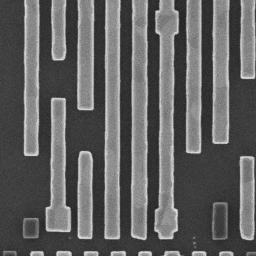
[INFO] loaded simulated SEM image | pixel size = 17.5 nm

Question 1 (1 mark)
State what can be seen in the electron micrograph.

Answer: wiring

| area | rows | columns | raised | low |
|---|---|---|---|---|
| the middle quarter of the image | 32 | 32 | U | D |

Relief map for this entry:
DDDDUUUDDDUUUUDDDUUUUDDDUUUDDDDU
DDDDUUUDDDUUUUDDDUUUUDDDUUUDDDDU
DDDDUUUDDDDUUUDDDUUUUDDDUUUDDDDU
DDDDUUUDDDDUUUDDDUUUUDDDUUUDDDDU
DDDDUUUDDDDUUUDDDUUUUDDDUUUDDDDU
DDDDUUUDDDDUUUDDDUUUUDDDUUUDDDDU
DDDDUUUDDDDUUUDDDUUUUDDDUUUDDDDU
DDDDUUUDDDDUUUDDDUUUUDDDUUUDDDDU
DDDDUUUDDDDUUUDDDUUUUDDDUUUDDDDU
DDDDUUUDDDDUUUDDDUUUUDDDUUUDDDDU
DDDDUUUDDDDUUUDDDUUUUDDDUUUDDDDU
DDDDDDDDDDDUUUDDDUUUUDDDUUUDDDDU
DDDDDDDDDDDUUUDDDUUUUDDDUUUDDDDU
DDDDDDDDDDDUUUDDDUUUUDDDUUUDDDDU
DDDDDDDDDDDUUUDDDUUUUDDDUUUDDDDU
DDDDDDDDDDDUUUDDDUUUUDDDUUUDDDDU
DDDDDDDDDDDUUUDDDUUUUDDDUUUDDDDU
DDDDDDDDDDUUUUDDDUUUUDDDUUUDDDDU
DDDDDDDDDDUUUUDDDUUUUDDDUUUDDDDU
DDDDDDDDDDUUUUDDDUUUUDDDUUUDDDDU
DDDDDDDDDDUUUUDDDUUUUDDDUUUDDDDU
DDDDDDDDDDUUUUDDDUUUUDDDUUUDDDDU
DDDDUUUDDDUUUUDDDUUUUDDDUUUDDDDD
DDDDUUUDDDUUUUDDDUUUUDDDUUUDDDDD
DDDDUUUDDDUUUUDDDUUUUDDDUUUDDDDD
DDDDUUUDDDUUUUDDDUUUUDDDUUUDDDDD
DDDDUUUDDDUUUUDDDUUUUDDDUUUDDDDD
DDDDUUUDDDUUUUDDDUUUUDDDUUUDDDDD
DDDDUUUDDDUUUUDDDUUUUDDDUUUDDDDD
DDDDUUUDDDUUUUDDDUUUUDDDUUUDDDDD
DDDDUUUDDDUUUUDDDUUUUDDDUUUDDDDD
DDDDUUUDDDUUUUDDDUUUUDDDUUUDDDDD